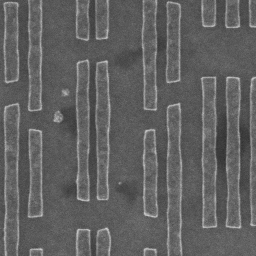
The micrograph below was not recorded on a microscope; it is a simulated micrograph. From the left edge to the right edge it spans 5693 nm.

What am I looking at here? wiring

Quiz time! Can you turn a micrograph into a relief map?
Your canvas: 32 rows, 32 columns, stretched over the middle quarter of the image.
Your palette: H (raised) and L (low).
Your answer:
LLLHHHLLHHHLLLLLLLLLHHHLLLHHHLLL
LLLHHHLLHHHLLLLLLLLLHHHLLLHHHLLL
LLLHHHLLHHHLLLLLLLLLHHHLLLHHHLLL
LLLHHHLLHHHLLLLLLLLLHHHLLLHHHLLL
LLLHHHLLHHHLLLLLLLLLHHHLLLHLLLLL
LLLHHHLLHHHLLLLLLLLLHHHLLLLLLLLL
LLLHHHLLHHHLLLLLLLLLHHHLLLLLLLLL
LLLHHHLLHHHLLLLLLLLLHHHLLLLLLLLL
LLLHHHLLHHHLLLLLLLLLHHHLLLLLLLLL
LLLHHHLLHHHLLLLLLLLLHHHLLLLLLLLL
LLLHHHLLHHHLLLLLLLLLHHHLLLHHHLLL
LLLHHHLLHHHLLLLLLLLLLLLLLLHHHLLL
LLLHHHLLHHHLLLLLLLLLLLLLLLHHHLLL
LLLHHHLLHHHLLLLLLLLLLLLLLLHHHLLL
LLLHHHLLHHHLLLLLLLLLLLLLLLHHHLLL
LLLHHHLLHHHLLLLLLLLLLLLLLLHHHLLL
LLLHHHLLHHHLLLLLLLLLLHHLLLHHHLLL
LLLHHHLLHHHLLLLLLLLLHHHLLLHHHLLL
LLLHHHLLHHHLLLLLLLLLHHHLLLHHHLLL
LLLHHHLLHHHLLLLLLLLLHHHLLLHHHLLL
LLLHHHLLHHHLLLLLLLLLHHHLLLHHHLLL
LLLHHHLLHHHLLLLLLLLLHHHLLLHHHLLL
LLLHHHLLHHHLLLLLLLLLHHHLLLHHHLLL
LLLHHHLLHHHLLLLLLLLLHHHLLLHHHLLL
LLLLHHLLLHHLLLLLLLLLHHHLLLHHHLLL
LLLLHHLLLHHLLLLLLLLLHHHLLLHHHLLL
LLLLHHLLLHHLLLLLLLLLHHHLLLHHHLLL
LLLHHHLLLHHLLLLLLLLLHHHLLLHHHLLL
LLLHHHLLLHHLLLLLLLLLHHHLLLHHHLLL
LLLHHHLLHHHLLLLLLLLLHHHLLLHHHLLL
LLLHHHLLHHHLLLLLLLLLHHHLLLHHHLLL
LLLHHHLLHHHLLLLLLLLLHHHLLLHHHLLL